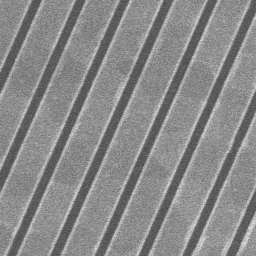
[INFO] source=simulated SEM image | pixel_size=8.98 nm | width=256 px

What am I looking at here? parallel lines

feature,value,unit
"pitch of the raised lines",0.36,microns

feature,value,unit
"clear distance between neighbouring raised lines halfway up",102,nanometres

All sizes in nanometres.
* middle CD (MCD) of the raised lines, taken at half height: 263